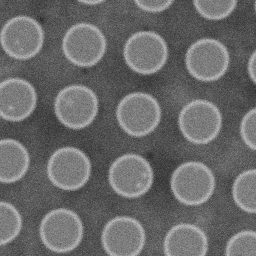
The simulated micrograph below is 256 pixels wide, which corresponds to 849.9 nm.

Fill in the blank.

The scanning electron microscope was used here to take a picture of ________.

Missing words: an array of small figures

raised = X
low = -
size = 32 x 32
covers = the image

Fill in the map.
-----------------XXXX---XXXXX---
-------------------------XXXX---
-XXX----------------------------
XXXXX----XXX--------------------
XXXXX---XXXXX----XXX------------
XXXXX---XXXXX---XXXXX---XXXX----
-XXXX---XXXXX---XXXXX---XXXX----
---------XXX----XXXXX--XXXXX---X
----------------XXXX----XXXX---X
------------------------XXX----X
XXXX----------------------------
XXXX----XXX---------------------
XXXX---XXXXX---XXXX-------------
XXXX---XXXXX---XXXXX---XXXX-----
XXX----XXXXX---XXXXX---XXXX----X
--------XXX----XXXXX--XXXXXX--XX
----------------XXX----XXXX---XX
------------------------XX-----X
XXX-----------------------------
XXX----XXXX-----X---------------
XXX---XXXXX---XXXX-----XX-------
XXX---XXXXX---XXXXX---XXXX-----X
XX----XXXXX---XXXXX---XXXXX---XX
--------XX----XXXXX---XXXXX--XXX
----------------X-----XXXX---XXX
X-----------------------X-----XX
XX----XXX-----------------------
XXX--XXXXX----XXX---------------
XX---XXXXX---XXXXX----XXX-------
XX---XXXXX---XXXXX---XXXXX---XXX
------XXXX---XXXXX---XXXXX---XXX
-------------XXXX----XXXXX--XXXX